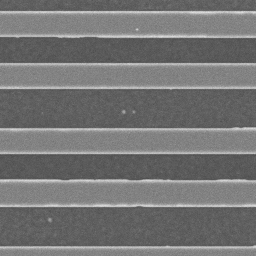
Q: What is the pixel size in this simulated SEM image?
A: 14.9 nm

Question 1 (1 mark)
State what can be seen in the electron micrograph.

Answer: lines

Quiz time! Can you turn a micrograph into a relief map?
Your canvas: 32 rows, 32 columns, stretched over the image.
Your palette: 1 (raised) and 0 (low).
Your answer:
00000000000000000000000000000000
11111111111111111111111111111111
11111111111111111111111111111111
11111111111111111111111111111111
11111111111111111111111111111111
00000000000000000000000000000000
00000000000000000000000000000000
00000000000000000000000000000000
11111111111111111111111111111111
11111111111111111111111111111111
11111111111111111111111111111111
00000000000000000000000000000000
00000000000000000000000000000000
00000000000000000000000000000000
00000000000000000000000000000000
00000000000000000000000000000000
11111111111111111111111111111111
11111111111111111111111111111111
11111111111111111111111111111111
00000000000000000000000000000000
00000000000000000000000000000000
00000000000000000000000000000000
11111111111111110111110000011110
11111111111111111111111111111111
11111111111111111111111111111111
11111111111111111111111111111111
00000000000000000000000000000000
00000000000000000000000000000000
00000000000000000000000000000000
00000000000000000000000000000000
00000000000000000000000000000000
11111111111111111111111111111111